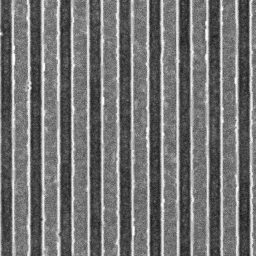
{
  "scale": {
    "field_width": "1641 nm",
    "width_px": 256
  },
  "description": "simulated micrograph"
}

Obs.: parallel lines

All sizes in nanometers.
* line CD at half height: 106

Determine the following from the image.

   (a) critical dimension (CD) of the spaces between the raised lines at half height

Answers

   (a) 80.9 nm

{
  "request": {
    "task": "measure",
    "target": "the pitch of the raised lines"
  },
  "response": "191 nm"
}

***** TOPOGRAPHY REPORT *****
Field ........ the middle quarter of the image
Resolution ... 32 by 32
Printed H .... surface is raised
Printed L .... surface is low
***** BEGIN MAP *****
LLHHHHLLLHHHHLLLLHHHHLLLHHHHLLLL
LLHHHHLLLLHHHLLLLHHHHLLLHHHHHLLL
LLHHHHLLLLHHHLLLLHHHHLLLLHHHLLLL
LLHHHHLLLLHHHLLLLHHHHLLLHHHHHLLL
LLHHHHLLLLHHHLLLLHHHHLLLHHHHHLLL
LLHHHHLLLLHHHLLLLHHHHLLLHHHHHLLL
LLHHHHLLLLHHHLLLLHHHHLLLHHHHHLLL
LLHHHHLLLLHHHLLLLHHHHLLLHHHHLLLL
LLHHHHLLLLHHHHLLLHHHHLLLHHHHHLLL
LLHHHHLLLHHHHHLLLHHHHLLLLHHHHLLL
LLHHHHLLLLHHHHLLLHHHHLLLHHHHLLLL
LLHHHHLLLHHHHHLLLHHHHLLLHHHHLLLL
LLHHHHLLLHHHHHLLLHHHHLLLHHHHHLLL
LLHHHHLLLLHHHHLLLHHHHLLLHHHHHLLL
LLHHHHLLLLHHHHLLLHHHHLLLHHHHHLLL
LLHHHHLLLLHHHHLLLHHHHLLLHHHHHLLL
LLHHHHLLLLHHHHLLLHHHHLLLHHHHHLLL
LLHHHHLLLLHHHHLLLHHHHLLLHHHHHLLL
LLHHHHLLLLHHHHLLLHHHHLLLHHHHHLLL
LLHHHHLLLLHHHHLLLHHHHLLLHHHHHLLL
LLHHHHLLLLHHHHLLLHHHHLLLHHHHHLLL
LLHHHHLLLLHHHHLLLHHHHLLLHHHHLLLL
LLHHHHLLLLHHHHLLLHHHHLLLHHHHHLLL
LLHHHHLLLLHHHHLLLHHHHLLLHHHHLLLL
LLHHHHLLLLHHHHLLLHHHHLLLHHHHHLLL
LLHHHHLLLLHHHHLLLHHHHLLLHHHHHLLL
LLHHHHLLLLHHHHLLLHHHHLLLHHHHLLLL
LLHHHHLLLLHHHHLLLHHHHLLLHHHHLLLL
LLHHHHLLLLHHHHLLLHHHHLLLHHHHLLLL
LLHHHHLLLLHHHHLLLHHHHLLLHHHHLLLL
LLHHHHLLLLHHHHLLLHHHHLLLLHHHLLLL
LLHHHHLLLLHHHHLLLHHHHLLLHHHHLLLL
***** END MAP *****